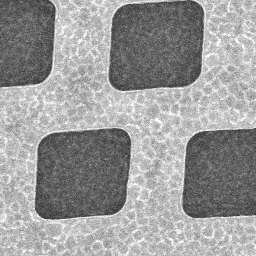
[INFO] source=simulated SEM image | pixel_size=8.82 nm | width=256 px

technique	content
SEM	holes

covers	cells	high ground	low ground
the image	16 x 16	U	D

DDDUUUUUDDDDDUUU
DDDUUUUDDDDDDUUU
DDDUUUUDDDDDDUUU
DDDUUUUDDDDDDUUU
DDDUUUUDDDDDDUUU
UUUUUUUDDDUUUUUU
UUUUUUUUUUUUUUUU
UUUUUUUUUUUUUUUU
UUUDDDDDUUUUDDDD
UUDDDDDDUUUUDDDD
UUDDDDDDUUUUDDDD
UUDDDDDDUUUDDDDD
UUDDDDDDUUUDDDDD
UUUDDDUUUUUUDDDD
UUUUUUUUUUUUUUUU
UUUUUUUUUUUUUUUU